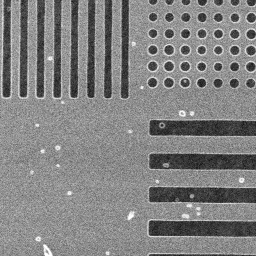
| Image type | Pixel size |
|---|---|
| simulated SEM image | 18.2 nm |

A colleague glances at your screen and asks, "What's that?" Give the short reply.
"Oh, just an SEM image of groups of lines, slits or small figures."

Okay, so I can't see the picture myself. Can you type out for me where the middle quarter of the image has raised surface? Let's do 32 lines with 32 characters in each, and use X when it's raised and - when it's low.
X---XX--XX--XX--XXXXX--XX---X---
X---XX--XX--XX--XXXXX--XX--XX--X
X---XX--XX--XX--XXXXXXXXXXXXXXXX
X---XX--XX--XX--XXXXX--XX--XXX-X
X---XX--XX--XX--XXXXX--XX--XX---
X---XX--XX--XX--XXXXX--XX--XX--X
X---XX--XX--XX--XXXXXXXXXXXXXXXX
X---XX--XX--XX--XXXXXXXXXXXXXXXX
XX-XXX-XXX--XX--XXXXXXXXXXXXXXXX
XXXXXXXXXXXXXXXXXXXXXXXXXXXXXXXX
XXXXXXXXXXXXXXXXXXXXXXXXXXXXXXXX
XXXXXXXXXXXXXXXXXXXXXXXXXXXXXXXX
XXXXXXXXXXXXXXXXXXXXXXXXXXXXXXXX
XXXXXXXXXXXXXXXXXXXXXXXXXXXXXXXX
XXXXXXXXXXXXXXXXXXXXX-----------
XXXXXXXXXXXXXXXXXXXXX-----------
XXXXXXXXXXXXXXXXXXXXX-----------
XXXXXXXXXXXXXXXXXXXXX-----------
XXXXXXXXXXXXXXXXXXXXXXXXXXXXXXXX
XXXXXXXXXXXXXXXXXXXXXXXXXXXXXXXX
XXXXXXXXXXXXXXXXXXXXXXXXXXXXXXXX
XXXXXXXXXXXXXXXXXXXXXXXXXXXXXXXX
XXXXXXXXXXXXXXXXXXXXX-----------
XXXXXXXXXXXXXXXXXXXXX-----------
XXXXXXXXXXXXXXXXXXXXX-----------
XXXXXXXXXXXXXXXXXXXXX----X------
XXXXXXXXXXXXXXXXXXXXXXXXXXXXX---
XXXXXXXXXXXXXXXXXXXXXXXXXXXXXXXX
XXXXXXXXXXXXXXXXXXXXXXXXXXXXXXXX
XXXXXXXXXXXXXXXXXXXXXXXXXXXXXXXX
XXXXXXXXXXXXXXXXXXXXXX--XXXXXXXX
XXXXXXXXXXXXXXXXXXXXX-----------